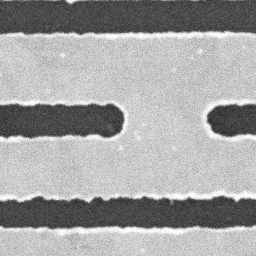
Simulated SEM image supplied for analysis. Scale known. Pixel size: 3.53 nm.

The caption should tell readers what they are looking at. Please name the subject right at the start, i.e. one or a few lines or trenches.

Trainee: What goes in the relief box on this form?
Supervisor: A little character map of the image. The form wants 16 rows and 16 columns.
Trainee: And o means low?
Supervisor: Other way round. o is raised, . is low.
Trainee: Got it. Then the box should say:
................
................
oooooooooooooooo
oooooooooooooooo
oooooooooooooooo
oooooooooooooooo
.o..o..ooooooo..
........ooooo...
.......ooooooo.o
oooooooooooooooo
oooooooooooooooo
oooooooooooooooo
................
................
oooooooooooooooo
oooooooooooooooo